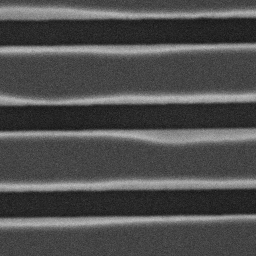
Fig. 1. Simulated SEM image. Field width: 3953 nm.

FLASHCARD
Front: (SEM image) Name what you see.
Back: lines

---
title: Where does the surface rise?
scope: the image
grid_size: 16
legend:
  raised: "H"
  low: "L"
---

HHHHHHHHHHHHHHHH
LLLLLLLLLLLLLLLL
LLLLLLLLLLLLLLLL
HHHHHHHHHHHHHHHH
HHHHHHHHHHHHHHHH
HHHHHHHHHHHHHHHH
LLLLLLLLLLLLLLLL
LLLLLLLLLLLLLLLL
HHHHHHHHHHHHHHHH
HHHHHHHHHHHHHHHH
HHHHHHHHHHHHHHHH
HHHHHHHHHHHHHHHH
LLLLLLLLLLLLLLLL
LLLLLLLLLLLLLLLL
HHHHHHHHHHHHHHHH
HHHHHHHHHHHHHHHH